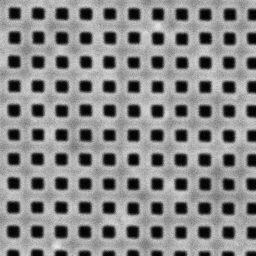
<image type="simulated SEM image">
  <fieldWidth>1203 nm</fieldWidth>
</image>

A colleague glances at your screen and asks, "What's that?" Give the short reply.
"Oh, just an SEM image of a regular array of holes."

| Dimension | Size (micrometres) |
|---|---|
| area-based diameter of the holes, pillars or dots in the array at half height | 0.0664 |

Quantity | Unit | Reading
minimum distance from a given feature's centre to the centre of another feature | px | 23.7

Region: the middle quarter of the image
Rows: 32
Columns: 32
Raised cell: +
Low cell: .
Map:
.+++...+++...+++...+++...+++...+
++++++++++++++++++++++++++++++++
++++++++++++++++++++++++++++++++
++++++++++++++++++++++++++++++++
.+++...+++...+++...+++...+++...+
.+++...+++...+++...+++...+++...+
.+++...+++...+++...+++...+++...+
++++++++++++++++++++++++++++++++
++++++++++++++++++++++++++++++++
++++++++++++++++++++++++++++++++
.+++...+++...+++...+++...+++...+
.+++...+++...+++...+++...+++...+
.+++...+++...+++...+++...+++...+
+++++++++++++++++.++++..++++++++
++++++++++++++++++++++++++++++++
++++++++++++++++++++++++++++++++
.+++...+++...+++...+++...+++...+
.+++...+++...+++...++....+++...+
.+++...+++...+++...++....+++...+
++++++++++...+++...+++...+++...+
++++++++++++++++++++++++++++++++
++++++++++++++++++++++++++++++++
.+++..++++...+++...+++..++++...+
.+++...++....+++...+++...++....+
.+++...++....+++...+++...+++...+
++++..++++++++++...+++...+++...+
++++++++++++++++++++++++++++++++
++++++++++++++++++++++++++++++++
++++..++++..++++...+++...+++..++
.++....++....+++...+++...+++...+
.++....++....+++...+++...+++...+
++++..++++...+++..++++...+++...+